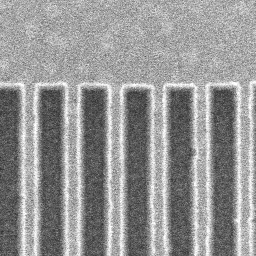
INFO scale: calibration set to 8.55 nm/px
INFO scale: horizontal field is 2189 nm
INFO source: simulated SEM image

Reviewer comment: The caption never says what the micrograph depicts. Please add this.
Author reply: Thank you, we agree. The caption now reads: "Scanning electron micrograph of parallel lines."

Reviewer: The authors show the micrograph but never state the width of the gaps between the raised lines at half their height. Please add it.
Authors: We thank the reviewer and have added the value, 24 px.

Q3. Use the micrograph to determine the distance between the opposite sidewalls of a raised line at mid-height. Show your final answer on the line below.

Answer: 161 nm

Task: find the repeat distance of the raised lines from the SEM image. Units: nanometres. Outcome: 368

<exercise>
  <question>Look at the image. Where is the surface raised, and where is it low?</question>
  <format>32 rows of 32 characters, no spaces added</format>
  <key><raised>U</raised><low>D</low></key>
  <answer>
UUUUUUUUUUUUUUUUUUUUUUUUUUUUUUUU
UUUUUUUUUUUUUUUUUUUUUUUUUUUUUUUU
UUUUUUUUUUUUUUUUUUUUUUUUUUUUUUUU
UUUUUUUUUUUUUUUUUUUUUUUUUUUUUUUU
UUUUUUUUUUUUUUUUUUUUUUUUUUUUUUUU
UUUUUUUUUUUUUUUUUUUUUUUUUUUUUUUU
UUUUUUUUUUUUUUUUUUUUUUUUUUUUUUUU
UUUUUUUUUUUUUUUUUUUUUUUUUUUUUUUU
UUUUUUUUUUUUUUUUUUUUUUUUUUUUUUUU
UUUUUUUUUUUUUUUUUUUUUUUUUUUUUUUU
UUUUUUUUUUUUUUUUUUUUUUUUUUUUUUUU
DDUUUDDDUUDDDUUUDDDUUDDDUUDDDUUU
DDDUUDDDUUDDDUUUDDDUUDDDUUDDDUUU
DDDUUDDDUUDDDUUUDDDUUDDDUUDDDDUU
DDDUUDDDUUDDDUUUDDDUUDDDUUDDDUUU
DDDUUDDDUUDDDUUUDDDUUDDDUUDDDUUU
DDUUUDDDUUDDDUUUDDDUUDDDUUDDDDUU
DDUUUDDDUUDDDUUUDDDUUDDDUUDDDUUU
DDDUUDDDUUDDDUUUDDDUUDDDUUDDDUUU
DDDUUDDDUUDDDUUUDDDUUDDDUUDDDDUU
DDDUUDDDUUDDDUUUDDDUUDDDUUDDDDUU
DDUUUDDDUUDDDUUUDDDUUDDDUUDDDDUU
DDUUUDDDUUDDDUUUDDDUUDDDUUDDDUUU
DDUUUDDDUUDDDUUUDDDUUDDDUUDDDUUU
DDDUUDDDUUDDDUUUDDDUUDDDUUDDDDUU
DDDUUDDDUUDDDUUUDDDUUDDDUUDDDUUU
DDDUUDDDUUDDDUUUDDDUUDDDUUDDDDUU
DDUUUDDDUUDDDUUUDDDUUDDDUUDDDUUU
DDDUUDDDUUDDDUUUDDDUUDDDUUDDDUUU
DDUUUDDDUUDDDUUUDDDUUDDDUUDDDDUU
DDDUUDDDUUDDDUUUDDDUUDDDUUDDDUUU
DDDUUDDDUUDDDUUUDDDUUDDDUUDDDUUU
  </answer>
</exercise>